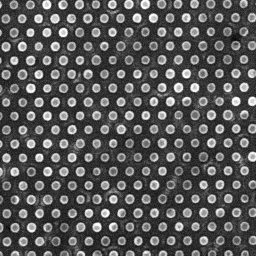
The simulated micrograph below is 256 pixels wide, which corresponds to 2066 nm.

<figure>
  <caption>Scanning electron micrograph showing a regular array of raised bodies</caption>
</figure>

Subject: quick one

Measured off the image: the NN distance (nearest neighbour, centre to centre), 0.129 micrometres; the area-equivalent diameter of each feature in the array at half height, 0.0644 µm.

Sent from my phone